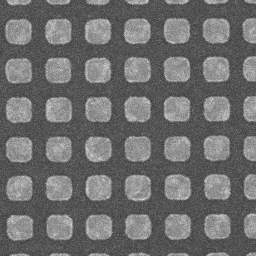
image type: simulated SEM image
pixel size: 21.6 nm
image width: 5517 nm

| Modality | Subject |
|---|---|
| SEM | a regular array of raised bodies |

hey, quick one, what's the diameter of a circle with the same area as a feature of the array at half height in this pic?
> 561 nm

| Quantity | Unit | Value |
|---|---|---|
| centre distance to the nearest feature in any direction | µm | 0.839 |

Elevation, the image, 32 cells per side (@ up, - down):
--------------------------------
--------------------------------
-----------------@---@@---@@---@
-@@@---@@--@@@--@@@--@@@--@@--@@
-@@@--@@@--@@@--@@@--@@@--@@---@
--------------------------------
--------------------------------
--@----@---@@---@@---@@---@@---@
-@@@--@@@--@@@--@@@--@@@--@@@--@
-@@@--@@@--@@@--@@@--@@@--@@@--@
--------------------------------
--------------------------------
-@@---@@---@@---@@---@@---@@---@
-@@@--@@@--@@@--@@@--@@@--@@@--@
-@@@--@@@--@@@--@@@--@@@--@@---@
--------------------------------
--------------------------------
-@@@--@@@--@@@--@@---@@---@@---@
-@@@--@@@--@@@--@@@--@@@--@@@--@
-@@@--@@@--@@@--@@@--@@@--@@---@
--------------------------------
--------------------------------
-@@@--@@@--@@@--@@@--@@@--@@@--@
-@@@--@@@--@@@--@@@--@@@--@@---@
-@@@--@@@--@@@--@@@--@@---@@---@
--------------------------------
--------------------------------
-@@@--@@@--@@@--@@@--@@@--@@@--@
-@@@--@@@--@@@--@@@--@@@--@@@--@
-@@@--@@@--@@@--@@@--@@---@@---@
--------------------------------
--------------------------------